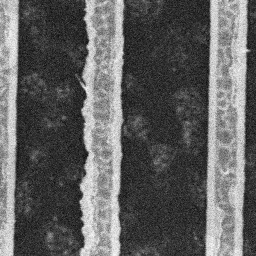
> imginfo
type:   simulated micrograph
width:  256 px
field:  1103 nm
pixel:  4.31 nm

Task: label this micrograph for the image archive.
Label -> one or a few lines or trenches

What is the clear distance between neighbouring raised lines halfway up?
375 nanometers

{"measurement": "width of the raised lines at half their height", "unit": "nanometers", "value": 122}